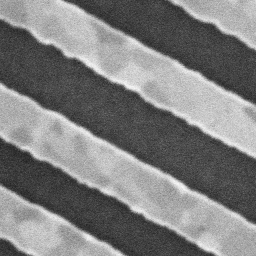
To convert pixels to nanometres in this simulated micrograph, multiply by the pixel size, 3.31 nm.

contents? lines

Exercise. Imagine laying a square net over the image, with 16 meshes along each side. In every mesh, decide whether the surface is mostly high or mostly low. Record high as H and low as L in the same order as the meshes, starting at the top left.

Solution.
HHHHHLLLLLLHHHHH
LHHHHHHLLLLLLHHH
LLHHHHHHLLLLLLLH
LLLLHHHHHHLLLLLL
LLLLLLHHHHHHLLLL
LLLLLLLLHHHHHHLL
HHLLLLLLLLHHHHHH
HHHHLLLLLLLLHHHH
HHHHHHLLLLLLLHHH
LLHHHHHHLLLLLLLH
LLLLHHHHHHLLLLLL
LLLLLHHHHHHLLLLL
HHLLLLLLHHHHHLLL
HHHLLLLLLHHHHHHL
HHHHHLLLLLLHHHHH
LHHHHHHLLLLLLHHH